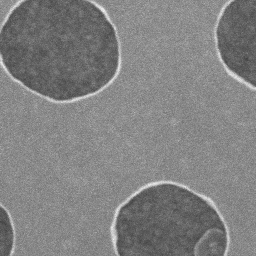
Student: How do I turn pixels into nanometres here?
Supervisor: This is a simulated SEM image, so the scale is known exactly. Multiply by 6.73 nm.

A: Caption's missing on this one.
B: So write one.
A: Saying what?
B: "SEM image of holes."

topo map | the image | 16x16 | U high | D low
UDDDDDUUUUUUUUDD
DDDDDDDUUUUUUUDD
DDDDDDDUUUUUUUDD
DDDDDDDUUUUUUUDD
UDDDDDDUUUUUUUDD
UUDDDDUUUUUUUUUU
UUUUUUUUUUUUUUUU
UUUUUUUUUUUUUUUU
UUUUUUUUUUUUUUUU
UUUUUUUUUUUUUUUU
UUUUUUUUUUUUUUUU
UUUUUUUUUUDUUUUU
UUUUUUUUDDDDDUUU
DUUUUUUDDDDDDDUU
DUUUUUUDDDDDDDUU
DUUUUUUDDDDDDDUU